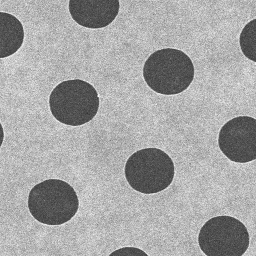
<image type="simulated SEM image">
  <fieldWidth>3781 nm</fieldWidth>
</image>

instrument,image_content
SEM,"holes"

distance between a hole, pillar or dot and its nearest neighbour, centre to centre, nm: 1480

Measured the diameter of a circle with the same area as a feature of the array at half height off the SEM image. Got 717 nm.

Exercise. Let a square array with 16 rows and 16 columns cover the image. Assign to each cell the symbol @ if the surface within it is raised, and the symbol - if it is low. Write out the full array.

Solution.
@@@@---@@@@@@@@@
-@@@@--@@@@@@@@-
-@@@@@@@@@@@@@@-
@@@@@@@@@---@@@-
@@@@@@@@@---@@@@
@@@---@@@---@@@@
@@@---@@@@@@@@@@
@@@@--@@@@@@@@--
@@@@@@@@@@@@@@--
@@@@@@@@@-@@@@--
@@@@@@@@---@@@@@
@@--@@@@---@@@@@
@@---@@@@@@@@@@@
@@---@@@@@@@@@@@
@@@@@@@@@@@@@--@
@@@@@@@@@@@@@--@